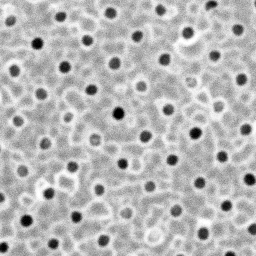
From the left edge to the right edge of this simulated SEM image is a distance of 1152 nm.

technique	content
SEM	a regular array of holes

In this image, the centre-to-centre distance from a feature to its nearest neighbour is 0.158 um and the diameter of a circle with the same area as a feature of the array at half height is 57.9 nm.